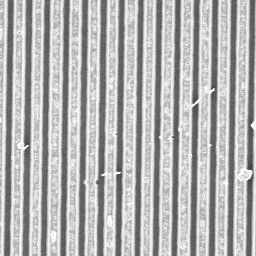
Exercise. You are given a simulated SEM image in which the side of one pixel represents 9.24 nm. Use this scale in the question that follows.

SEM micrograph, parallel lines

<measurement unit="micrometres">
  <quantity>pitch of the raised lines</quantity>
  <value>0.172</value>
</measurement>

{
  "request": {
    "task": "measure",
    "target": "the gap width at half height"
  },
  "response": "77.4 nanometres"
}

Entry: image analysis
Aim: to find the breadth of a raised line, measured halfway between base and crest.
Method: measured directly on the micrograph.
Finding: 94.7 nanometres